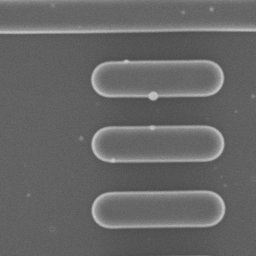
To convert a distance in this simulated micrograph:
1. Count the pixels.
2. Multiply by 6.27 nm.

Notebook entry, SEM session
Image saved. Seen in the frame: groups of lines, slits or small figures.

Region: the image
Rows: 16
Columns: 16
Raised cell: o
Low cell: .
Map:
oooooooooooooooo
oooooooooooooooo
................
................
......oooooooo..
......oooooooo..
................
................
......oooooooo..
......oooooooo..
................
................
......oooooooo..
......oooooooo..
................
................